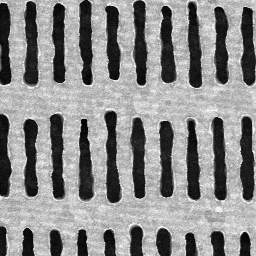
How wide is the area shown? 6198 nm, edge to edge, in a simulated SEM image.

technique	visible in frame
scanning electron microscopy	a regular array of holes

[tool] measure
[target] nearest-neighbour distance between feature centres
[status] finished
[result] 651 nanometers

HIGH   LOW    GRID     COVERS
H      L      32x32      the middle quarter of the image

HHHHHLLHHHHLLLHHHHLLLHHHLLLLHHHL
HHHHLLLHHHHLLLHHHHLLLHHHLLLLHHHL
HHHHLLLHHHHLLLHHHHLLHHHHLLLLHHHL
HHHHLLLHHHHLLLHHHHLLHHHHLLLLHHHL
HHHHHLLHHHHHHHHHHHLLHHHHHLLHHHHL
HHHHHHHHHHHHHHHHHHHHHHHHHHHHHHHH
HHHHHHHHHHHHHHHHHHHHHHHHHHHHHHHH
HHHHHHHHHHHHHHHHHHHHHHHHHHHHHHHH
HHHHHHHHHHHHHHHHHHHHHHHHHHHHHHHH
HHHHHHHHHHHHHHHHHHHHHHHHHHHHHHHH
HHHHHHHHHHHHHHHHHHHHHHHHHHHHHHHH
HHHHHHHHHHHHHHHHHHHHHHHHHHHHHHHH
HHHHHHHHHHLLLHHHHHHHHHHHHHHHHHHH
HHHHHHHHHHLLLHHHHHLHHHHHHHHHHHHH
HHHHLLHHHHLLLHHHHLLLHHHHLLHHHHHL
HHHHLLHHHHHLLHHHHLLLHHHHLLLHHHHL
HHHHLLHHHHHLLHHHHLLLHHHHLLLHHHHL
HHHHLLHHHHHLLHHHHLLLHHHHLLLLHHHL
HHHHLLHHHHHLLHHHHLLLLHHHLLLHHHHL
HHHHLLHHHHHLLHHHHLLLLHHHLLLHHHHL
HHHHLLHHHHLLLHHHHLLLHHHHLLLHHHHL
HHHHLLLHHHHLLHHHHLLLHHHHLLLHHHHL
HHHHLLLHHHHLLHHHHLLLHHHHLLLHHHHL
HHHHLLLHHHHLLHHHHLLLHHHHLLLHHHLL
HHHHLLLHHHHLLHHHHLLLHHHHLLLHHHHL
HHHHLLLHHHHLLHHHHLLLHHHHLLLHHHHL
HHHHLLLHHHHLLHHHHLLLHHHHLLLHHHHL
HHHHLLLHHHHLLLHHHLLLHHHHLLLHHHHL
HHHHLLLHHHLLLLHHHLLLHHHHLLLHHHHL
HHHHLLLLHHLLLLHHHLLLHHHHLLLHHHHL
HHHHLLLHHHHLLLHHHHLLHHHHLLLLHHHL
HHHHLLLHHHHLLLHHHLLLHHHHLLLHHHHL